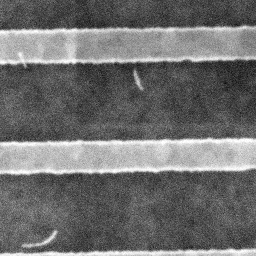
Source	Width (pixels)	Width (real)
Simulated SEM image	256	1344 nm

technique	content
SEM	lines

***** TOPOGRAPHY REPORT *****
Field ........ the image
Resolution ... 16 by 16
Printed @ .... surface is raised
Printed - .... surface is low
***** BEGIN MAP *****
----------------
----------------
@@@@@@@@@@@@@@@@
@@@@@@@@@@@@@@@@
----------------
----------------
----------------
----------------
----------------
@@@@@@@@@@@@@@@@
@@@@@@@@@@@@@@@@
----------------
----------------
----------------
----------------
----------------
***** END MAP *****